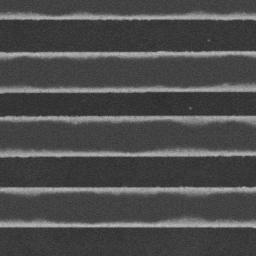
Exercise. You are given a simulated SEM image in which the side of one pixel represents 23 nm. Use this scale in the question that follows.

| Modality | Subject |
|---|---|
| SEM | lines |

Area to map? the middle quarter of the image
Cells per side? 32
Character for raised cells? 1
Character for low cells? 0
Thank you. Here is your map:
11111111111111111111111111111111
11111111111111111111111111111111
11111111111111111111111111111111
11111111111111111111111111111111
11111111111111111111111111111111
11111111111111111111111111111111
11111111111111111111111111111111
00000000000000000000000000000000
00000000000000000000000000000000
00000000000000000000000000000000
00000000000000000000000000000000
00000000000000000000000000000000
00000000000000000000000000000000
00000000001100110001111111111000
11111111111111111111111111111111
11111111111111111111111111111111
11111111111111111111111111111111
11111111111111111111111111111111
11111111111111111111111111111111
11111111111111111111111111111111
11111111111111111111111111111111
11111111111111111111111111111111
11111111111111111111111111111111
00000000000000000000000000000000
00000000000000000000000000000000
00000000000000000000000000000000
00000000000000000000000000000000
00000000000000000000000000000000
00000000000000000000000000000000
00000000000000000000000000000000
00000000000000000000000000000000
11111111111111111111111111111111